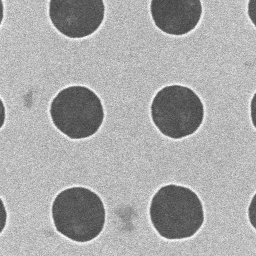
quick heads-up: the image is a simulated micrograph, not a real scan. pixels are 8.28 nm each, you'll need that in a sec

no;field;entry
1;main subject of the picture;holes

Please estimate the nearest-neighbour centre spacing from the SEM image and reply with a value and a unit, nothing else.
818 nanometers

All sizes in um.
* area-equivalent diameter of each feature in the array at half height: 0.445